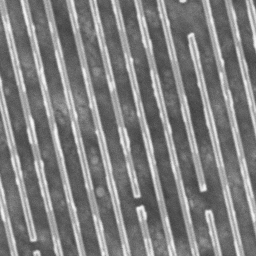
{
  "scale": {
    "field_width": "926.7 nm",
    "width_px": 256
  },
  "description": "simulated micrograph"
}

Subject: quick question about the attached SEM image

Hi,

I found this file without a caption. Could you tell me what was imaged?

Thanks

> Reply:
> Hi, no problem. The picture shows parallel lines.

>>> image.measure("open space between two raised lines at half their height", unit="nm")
57.8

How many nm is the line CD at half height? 21.6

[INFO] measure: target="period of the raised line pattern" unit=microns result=0.0799